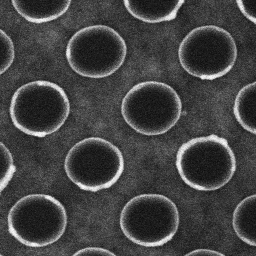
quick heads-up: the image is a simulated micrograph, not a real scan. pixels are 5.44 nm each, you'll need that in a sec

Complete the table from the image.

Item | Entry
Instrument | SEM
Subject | a regular array of raised bodies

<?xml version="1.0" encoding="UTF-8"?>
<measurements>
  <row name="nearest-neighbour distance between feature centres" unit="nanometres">428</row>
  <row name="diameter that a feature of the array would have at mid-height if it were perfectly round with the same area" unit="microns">0.301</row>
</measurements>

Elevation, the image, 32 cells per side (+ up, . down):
..+++++++.......+++++++.......++
..++++++........++++++........++
...+++............+++..........+
...........+++...........++.....
+........++++++........++++++...
++.......+++++++.......++++++...
++......++++++++......+++++++...
++.......++++++.......+++++++...
+........++++++........++++++...
...........++...........++++....
...++++..........+++...........+
..++++++........++++++........++
.+++++++.......+++++++.......+++
.++++++++......++++++++......+++
.+++++++.......+++++++.......+++
..++++++........++++++........++
...++++..........++++...........
...........++...........++++....
+........+++++........+++++++...
+.......+++++++.......+++++++...
++......+++++++.......+++++++...
++......+++++++.......+++++++...
+........++++++........++++++...
+.........+++...........+++.....
....++...........+++...........+
..+++++.........++++++........++
.+++++++.......+++++++.......+++
.+++++++.......+++++++.......+++
.+++++++.......+++++++.......+++
..++++++........++++++........++
...+++...........+++...........+
..........++++..........+++.....